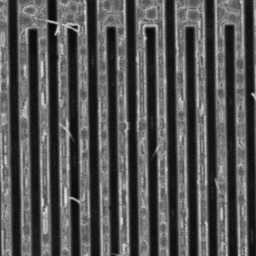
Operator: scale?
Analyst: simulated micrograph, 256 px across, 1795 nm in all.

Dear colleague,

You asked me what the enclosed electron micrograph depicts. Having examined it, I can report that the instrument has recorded parallel lines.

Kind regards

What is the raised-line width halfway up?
74.4 nanometres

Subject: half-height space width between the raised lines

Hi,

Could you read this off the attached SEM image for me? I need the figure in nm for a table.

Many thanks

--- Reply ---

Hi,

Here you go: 61.3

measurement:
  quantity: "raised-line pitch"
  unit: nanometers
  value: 138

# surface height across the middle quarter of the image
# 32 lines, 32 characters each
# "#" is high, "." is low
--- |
#...##..###..##...###..##...##..
#...##..###..##...###..##...##..
#...##..###..##...###..##...##..
#...##..###..###..###..##...##..
#...##..###..###..###..###..##..
#...##..###..###..###..###..##..
#...##..###..###..###..###..##..
#...##...##..###..###..###..##..
#...##...##..###..###..###..##..
#...##...##..###..###..###..##..
#...##...##..###..###..###..##..
#...##...##..###..###..###..##..
#...##...##..###..###..###..##..
#...##...##..###..###..###..###.
#...##...##..###..###..###..###.
#...##...##...##..###..###..###.
#...##...##...##..###..###..###.
##..##...##...##..###..###..###.
#...##...##...##..###..###..###.
#...##...##...##..###..###..###.
#...##...##...##..###..###..###.
#...##...##...##..###..###..###.
#...##...##...##..###..###..###.
#...##...##...##..###..###..###.
#...##...##...##...##..###..###.
#...##...##...##...##..###...##.
#...##...##...##...##..###...##.
#...##...##...##...##..###...##.
#...##...##...##...##..###...##.
#...##...##...##...##..###...##.
#...##...##...##...##..###...##.
#...##...##...##...##..###...##.